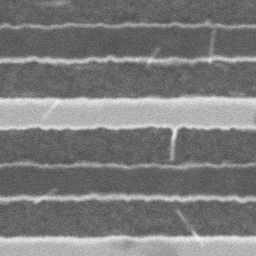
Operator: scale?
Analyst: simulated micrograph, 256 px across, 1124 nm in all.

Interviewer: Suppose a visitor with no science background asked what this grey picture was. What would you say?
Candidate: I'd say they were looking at lines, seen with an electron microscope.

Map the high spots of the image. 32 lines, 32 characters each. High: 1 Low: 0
00000000000000000000000000000000
00000000000000000000000000000000
00000000000000000000000000000000
11111111111111111111111111111111
11111111111111111111111111111111
11111111111111111111111111111111
11111111111111111111111111111111
11111111111111111111111111101111
00000000000000000000000000000000
00000000000000000000000000000000
00000000000000000000000000000000
00000000000000000000000000000000
11111111011011111111111111111111
11111111111111111111111111111111
11111111111111111111111111111111
11111111111111111111111111111111
00000000000000000000000000000000
00000000000000000000000000000000
00000000000000000000000000000000
00000000000000000000000000000000
11111000011000000001000001000001
11111111111111111111111111111111
11111111111111111111111111111111
11111111111111111111111111111111
11111111111111111111111111111111
00000000000000000000000000000000
00000000000000000000000000000000
00000000000000000000000000000000
00000000000000000000000000000000
00000000000000010000000010000000
11111111111111111111111111111111
11111111111111111111111111111111